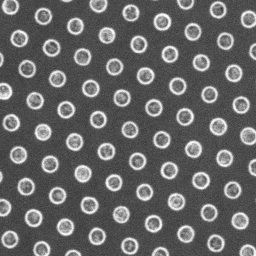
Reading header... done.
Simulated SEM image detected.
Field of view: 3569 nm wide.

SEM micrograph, a regular array of raised bodies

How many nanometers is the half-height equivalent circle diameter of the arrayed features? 206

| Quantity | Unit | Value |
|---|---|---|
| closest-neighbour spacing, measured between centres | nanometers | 446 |